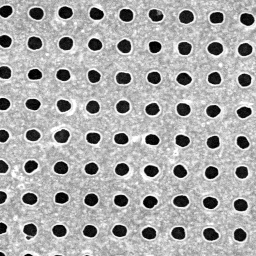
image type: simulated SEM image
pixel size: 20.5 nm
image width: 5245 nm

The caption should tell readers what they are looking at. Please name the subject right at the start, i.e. a regular array of holes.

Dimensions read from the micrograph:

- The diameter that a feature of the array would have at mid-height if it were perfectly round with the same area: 283 nanometers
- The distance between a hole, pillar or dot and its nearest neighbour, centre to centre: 29.5 px